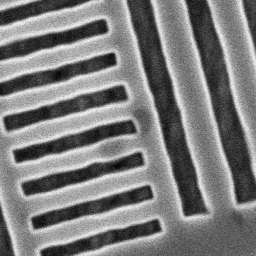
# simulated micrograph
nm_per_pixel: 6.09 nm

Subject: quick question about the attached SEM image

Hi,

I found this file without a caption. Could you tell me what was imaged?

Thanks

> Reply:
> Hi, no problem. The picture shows groups of lines, slits or small figures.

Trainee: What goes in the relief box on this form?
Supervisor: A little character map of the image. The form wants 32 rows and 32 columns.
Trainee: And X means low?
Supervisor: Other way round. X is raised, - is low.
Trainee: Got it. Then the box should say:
XXX--------XXXXX---XXXX---XXXX--
-------XXXXXXXXX---XXXX---XXXX--
---XXXXXXXXX-XXX---XXXXX---XXXX-
XXXXXXXXX-----XX----XXXX---XXXX-
XXXX--------XXXXX---XXXX---XXXX-
---------XXXXXXXX---XXXX----XXX-
-----XXXXXXXXXXXX---XXXXX---XXXX
-XXXXXXXXX-----XXX---XXXX---XXXX
XXXXXXX-------XXXX---XXXX---XXXX
XX--------XXXXXXXX---XXXX----XXX
-------XXXXXXXXXXX----XXXX---XXX
---XXXXXXXX-----XXX---XXXX---XXX
XXXXXXXX--------XXX---XXXX---XXX
XXXX--------XXXXXXX----XXX----XX
X-------XXXXXXXXXXXX---XXXX---XX
----XXXXXXXXX----XXX---XXXX---XX
XXXXXXXXXX-------XXX---XXXX----X
XXXXXX-------XXXXXXX---XXXX----X
XX--------XXXXXXXXXXX---XXXX---X
XX----XXXXXXXXXX--XXX---XXXX---X
XXXXXXXXXXX-------XXX---XXXX----
XXXXXXX--------XXXXXXX---XXXX---
XXX--------XXXXXXXXXXX---XXXX---
XXX-----XXXXXXXXX--XXX---XXXX---
XXX-XXXXXXXXX------XXX---XXXX---
XXXXXXXXXX-------XXXXXX---XXXX-X
XXXXXX-------XXXXXXXXXX---XXXXXX
-XXX-----XXXXXXXXXX-XXXXXXXXXXXX
-XXX--XXXXXXXXX-----XXXXXXXXXXXX
-XXXXXXXXXX--------XXXXXXXXXXXXX
--XXXXX-------XXXXXXXXXXXXXXXXXX
--XXX------XXXXXXXXXXXXXXXXXXXXX